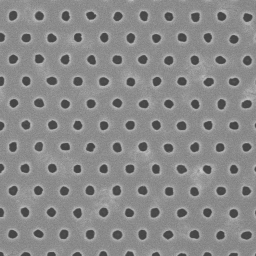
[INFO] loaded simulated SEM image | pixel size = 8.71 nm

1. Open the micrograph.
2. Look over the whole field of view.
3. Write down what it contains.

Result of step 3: a regular array of holes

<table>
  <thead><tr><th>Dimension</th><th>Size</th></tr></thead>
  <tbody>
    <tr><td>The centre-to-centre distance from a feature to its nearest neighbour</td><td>216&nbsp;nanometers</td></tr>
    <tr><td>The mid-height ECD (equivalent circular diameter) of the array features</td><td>78.6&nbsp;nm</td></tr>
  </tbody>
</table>